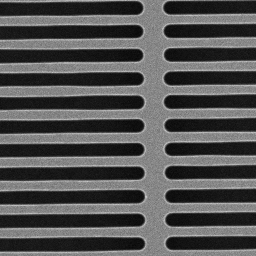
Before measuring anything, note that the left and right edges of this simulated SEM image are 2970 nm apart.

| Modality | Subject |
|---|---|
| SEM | groups of lines, slits or small figures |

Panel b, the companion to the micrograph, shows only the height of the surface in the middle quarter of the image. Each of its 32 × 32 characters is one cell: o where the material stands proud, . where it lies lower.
oooooooooooooooooooooooooooooooo
oooooooooooooooooooooooooooooooo
...................ooooooo......
....................ooooo.......
....................ooooo.......
..................ooooooooo..ooo
oooooooooooooooooooooooooooooooo
oooooooooooooooooooooooooooooooo
....................ooooo.......
....................ooooo.......
....................ooooo.......
oo...........ooooooooooooooooooo
oooooooooooooooooooooooooooooooo
oooooooooooooooooooooooooooooooo
....................ooooo.......
....................ooooo.......
....................oooooo......
oooooooooooooooooooooooooooooooo
oooooooooooooooooooooooooooooooo
oooooooooooooooooooooooooooooooo
....................oooooo......
....................ooooo.......
....................oooooo......
oooooooooooooooooooooooooooooooo
oooooooooooooooooooooooooooooooo
ooooooooooooooooooooooooooo.....
....................ooooo.......
....................ooooo.......
....................oooooo......
oooooooooooooooooooooooooooooooo
oooooooooooooooooooooooooooooooo
oooo...............oooooooo.....